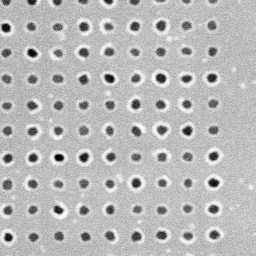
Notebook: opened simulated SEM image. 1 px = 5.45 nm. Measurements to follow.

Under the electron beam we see a regular array of holes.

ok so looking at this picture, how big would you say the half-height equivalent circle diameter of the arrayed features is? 57 nm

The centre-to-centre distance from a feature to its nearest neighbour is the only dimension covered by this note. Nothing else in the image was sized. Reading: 138 nm